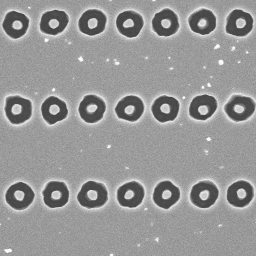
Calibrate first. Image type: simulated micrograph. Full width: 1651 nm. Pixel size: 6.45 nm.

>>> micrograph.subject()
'a regular array of ring-shaped grooves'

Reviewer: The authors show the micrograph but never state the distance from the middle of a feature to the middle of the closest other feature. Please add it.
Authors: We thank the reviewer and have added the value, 36 pixels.